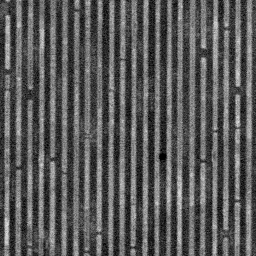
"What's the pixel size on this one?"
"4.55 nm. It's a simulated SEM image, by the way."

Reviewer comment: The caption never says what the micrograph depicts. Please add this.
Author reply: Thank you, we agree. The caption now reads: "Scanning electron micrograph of parallel lines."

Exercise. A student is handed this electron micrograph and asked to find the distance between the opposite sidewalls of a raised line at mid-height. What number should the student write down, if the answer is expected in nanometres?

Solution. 13.1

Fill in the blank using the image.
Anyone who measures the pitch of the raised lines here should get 52.5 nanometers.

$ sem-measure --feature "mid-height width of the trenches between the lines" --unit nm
40.4